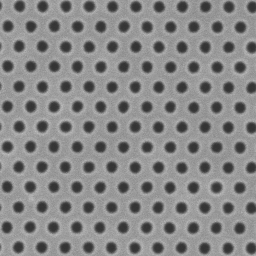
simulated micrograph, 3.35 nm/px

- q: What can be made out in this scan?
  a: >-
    a regular array of holes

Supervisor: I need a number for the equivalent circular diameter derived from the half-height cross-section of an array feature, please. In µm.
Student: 0.0389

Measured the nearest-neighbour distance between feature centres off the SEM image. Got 76.5 nm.